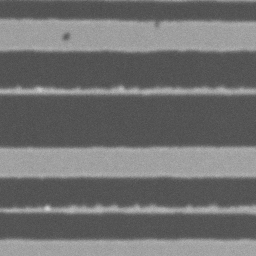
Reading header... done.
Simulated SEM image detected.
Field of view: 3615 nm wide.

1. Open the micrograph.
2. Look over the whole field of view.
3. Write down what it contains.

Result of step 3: lines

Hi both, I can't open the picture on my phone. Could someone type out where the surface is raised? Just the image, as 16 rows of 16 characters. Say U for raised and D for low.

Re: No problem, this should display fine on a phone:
DDDDDDDDDDDDDDDD
UUUUUUUUUUUUUUUU
UUUUUUUUUUUUUUUU
DDDDDDDDDDDDDDDD
DDDDDDDDDDDDDDDD
DDDDDDDDDDDDDDDD
DDDDDDDDDDDDDDDD
DDDDDDDDDDDDDDDD
DDDDDDDDDDDDDDDD
UUUUUUUUUUUUUUUU
UUUUUUUUUUUUUUUU
DDDDDDDDDDDDDDDD
DDDDDDDDDDDDDDDD
DDDDDDDDDDDDDDDD
DDDDDDDDDDDDDDDD
UUUUUUUUUUUUUUUU